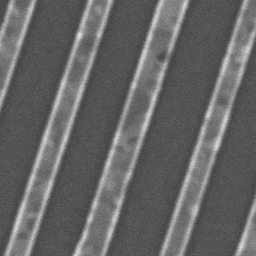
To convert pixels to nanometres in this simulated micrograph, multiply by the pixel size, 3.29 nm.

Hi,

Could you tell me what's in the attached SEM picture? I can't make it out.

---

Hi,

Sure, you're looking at one or a few lines or trenches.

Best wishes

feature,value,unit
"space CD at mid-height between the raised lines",0.179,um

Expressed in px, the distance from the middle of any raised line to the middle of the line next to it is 73.3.